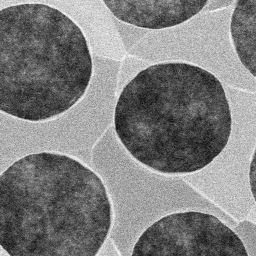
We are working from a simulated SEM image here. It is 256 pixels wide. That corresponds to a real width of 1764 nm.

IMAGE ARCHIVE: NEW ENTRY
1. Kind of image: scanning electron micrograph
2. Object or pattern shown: holes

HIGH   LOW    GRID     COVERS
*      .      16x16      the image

...****......**.
.....***...***..
.....*********..
......*********.
......***....***
.....***......**
.....**.......**
**.****.......**
*******.......**
********......**
*....****....***
......**********
.......*********
.......***...***
.......**......*
......**.......*